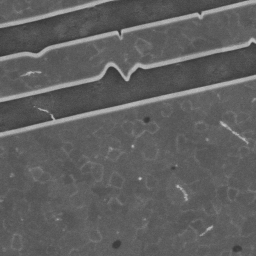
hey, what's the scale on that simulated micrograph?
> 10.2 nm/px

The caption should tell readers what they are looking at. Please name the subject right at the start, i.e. one or a few lines or trenches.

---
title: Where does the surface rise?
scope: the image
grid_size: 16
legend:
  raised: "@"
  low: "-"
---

@@@@@---------@@
@---------@@@@@@
-----@@@@@@@@@@@
-@@@@@@@@@@@----
@@@@@@----------
@@@----------@@@
--------@@@@@@@@
----@@@@@@@@@@@@
@@@@@@@@@@@@@@@@
@@@@@@@@@@@@@@@@
@@@@@@@@@@@@@@@@
@@@@@@@@@@@@@@@@
@@@@@@@@@@@@@@@@
@@@@@@@@@@@@@@@@
@@@@@@@@@@@@@@@@
@@@@@@@@@@@@@@@@